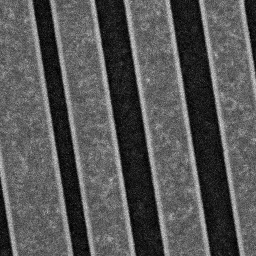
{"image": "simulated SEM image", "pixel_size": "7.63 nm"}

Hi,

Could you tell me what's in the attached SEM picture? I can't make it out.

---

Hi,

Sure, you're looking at one or a few lines or trenches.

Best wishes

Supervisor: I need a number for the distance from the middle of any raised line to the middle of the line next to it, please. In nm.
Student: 554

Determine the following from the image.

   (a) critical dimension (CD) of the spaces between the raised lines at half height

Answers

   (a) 0.251 microns